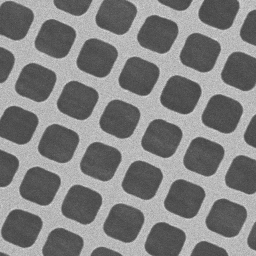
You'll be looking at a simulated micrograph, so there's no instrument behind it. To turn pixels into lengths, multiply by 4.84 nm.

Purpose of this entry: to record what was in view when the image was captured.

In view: a regular array of holes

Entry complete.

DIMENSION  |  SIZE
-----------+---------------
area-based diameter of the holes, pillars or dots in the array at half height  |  188 nm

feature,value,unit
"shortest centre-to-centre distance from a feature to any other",222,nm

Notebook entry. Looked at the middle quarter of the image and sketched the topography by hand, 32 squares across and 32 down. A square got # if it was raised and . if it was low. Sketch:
###.........###........########.
####........###.........########
######.....###..........########
##############..........###....#
#...##########.........###......
......########.........##.......
........########......###.......
.........#########...###........
.........###############........
........###.....########........
........###.......#######.......
.......###.........########.....
.......###.........##########..#
##....###..........#############
#########..........###....######
#########.........###.......####
..########........##.........###
...########......###..........##
....##########..####..........##
....####.##########..........###
...###.....########..........##.
...##.........######........###.
...##.........########.....###..
..###.........###########.####..
.###..........###...##########..
####..........##.......#######..
####.........###........#######.
#####........##..........#######
#######.....###..........#######
##############..........###.....
##...#########..........###.....
#......########.........##......